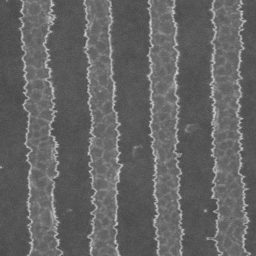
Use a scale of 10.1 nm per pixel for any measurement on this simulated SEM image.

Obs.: one or a few lines or trenches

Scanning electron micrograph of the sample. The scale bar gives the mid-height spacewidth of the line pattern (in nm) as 377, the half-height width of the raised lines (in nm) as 260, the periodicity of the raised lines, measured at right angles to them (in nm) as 634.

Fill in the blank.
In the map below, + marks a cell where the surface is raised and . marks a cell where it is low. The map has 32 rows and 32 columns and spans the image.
....++.....+++.....+++.....+++..
...+++.....+++.....++......+++..
...++++....+++.....+++.....+++..
...+++.....+++.....+++.....+++..
...+++.....+++.....+++.....+++..
...+++.....+++.....+++.....+++..
...+++.....+++.....+++.....+++..
...+++.....+++.....+++.....+++..
...+++.....+++.....+++.....+++..
...+++.....+++.....+++.....+++..
...+++.....+++.....+++.....+++..
...++++....+++.....+++.....+++..
...++++....+++.....+++.....+++..
...++++....+++.....+++.....+++..
....+++....++++....+++.....+++..
....++.....++++....+++.....+++..
...+++......+++....+++.....+++..
...++++.....+++....+++.....+++..
....+++....++++....+++.....+++..
...++++....++++....+++.....+++..
....+++....++++.....++.....+++..
....+.+....++++....++++......+..
....+++.....+++....+++.....+++..
....+++.....+......+++.....+++..
....+++.....+++....+++.....+++..
....+++.....+++.....++.....++++.
....+++.....+++.....+++....++++.
....+++.....++.....++++....+..+.
....+++.....++......+++....++++.
....+++....+++......+++....++++.
....+++....++++.....+++....+++..
....++++...++++.....+++....++++.